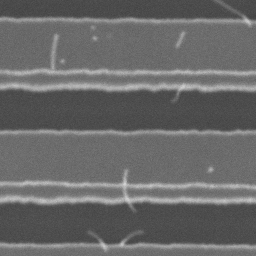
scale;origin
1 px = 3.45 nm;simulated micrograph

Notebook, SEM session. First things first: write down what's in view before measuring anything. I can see lines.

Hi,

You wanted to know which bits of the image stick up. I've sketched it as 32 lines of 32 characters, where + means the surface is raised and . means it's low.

................................
................................
++++++++++++++++++......++....+.
++++++++++++++++++++++++++++++++
++++++++++++++++++++++++++++++++
++++++++++++++++++++++++++++++++
++++++++++++++++++++++++++++++++
++++++++++++++++++++++++++++++++
++++++++++++++++++++++++++++++++
++++++++++++++++++++++++++++++++
++++++++++++++++++++++++++++++++
................................
................................
................................
................................
................................
+++++++++++++++..+++++++++++.+++
++++++++++++++++++++++++++++++++
++++++++++++++++++++++++++++++++
++++++++++++++++++++++++++++++++
++++++++++++++++++++++++++++++++
++++++++++++++++++++++++++++++++
++++++++++++++++++++++++++++++++
++++++++++++++++++++++++++++++++
++++++++++++++++++++++++++++++++
................................
................................
................................
................................
................................
............+..+................
++++++++++++++++++++++++++++++++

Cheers